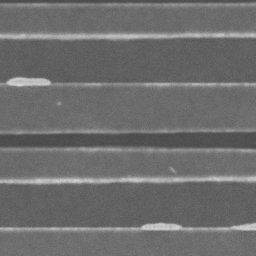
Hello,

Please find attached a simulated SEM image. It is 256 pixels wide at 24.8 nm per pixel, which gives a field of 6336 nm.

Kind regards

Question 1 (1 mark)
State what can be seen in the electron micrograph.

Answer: lines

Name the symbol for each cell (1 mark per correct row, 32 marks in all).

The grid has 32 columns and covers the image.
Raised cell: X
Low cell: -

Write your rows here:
--------------------------------
XXXXXXXXXXXXXXXXXXXXXXXXXXXXXXXX
XXXXXXXXXXXXXXXXXXXXXXXXXXXXXXXX
XXXXXXXXXXXXXXXXXXXXXXXXXXXXXXXX
--------------------------------
--------------------------------
--------------------------------
--------------------------------
--------------------------------
--------------------------------
XXXXXXXXXXXXXXXXXXXXXXXXX-XXXXXX
XXXXXXXXXXXXXXXXXXXXXXXXXXXXXXXX
XXXXXXXXXXXXXXXXXXXXXXXXXXXXXXXX
XXXXXXXXXXXXXXXXXXXXXXXXXXXXXXXX
XXXXXXXXXXXXXXXXXXXXXXXXXXXXXXXX
XXXXXXXXXXXXXXXXXXXXXXXXXXXXXXXX
XXXXXXXX------------------------
--------------------------------
--------------------------------
XXXXXXXXXXXXXXXXXXXXXXXXXXXXXXXX
XXXXXXXXXXXXXXXXXXXXXXXXXXXXXXXX
XXXXXXXXXXXXXXXXXXXXXXXXXXXXXXXX
XXXXXXXXXXXXXX------------------
--------------------------------
--------------------------------
--------------------------------
--------------------------------
--------------------------------
-----------------XXXXXX-----XXXX
XXXXXXXXXXXXXXXXXXXXXXXXXXXXXXXX
XXXXXXXXXXXXXXXXXXXXXXXXXXXXXXXX
XXXXXXXXXXXXXXXXXXXXXXXXXXXXXXXX